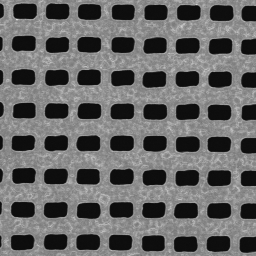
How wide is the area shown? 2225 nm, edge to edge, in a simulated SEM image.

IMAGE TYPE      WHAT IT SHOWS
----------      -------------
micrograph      a regular array of holes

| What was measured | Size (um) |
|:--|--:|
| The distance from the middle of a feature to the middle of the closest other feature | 0.28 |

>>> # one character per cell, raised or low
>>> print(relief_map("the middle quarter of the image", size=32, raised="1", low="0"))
11111111111111111111111111111111
11111000111111110111111111111111
01110000011100000011000000110000
01100000011100000011000000110000
01100000011100000011000001110000
11111111111110001111000001110000
11111111111111111111111111111111
11111111111111111111111111111111
11111111111111111111111111111111
11111111111111111111111111111111
01110000011100000111000000110000
01100000011100000011000000110000
01100000011000000011000000110000
11110000011100000111000001110000
11111111111111111111111111111111
11111111111111111111111111111111
11111111111111111111111111111111
11111111111111111111111111111111
01100000011100000111000000110000
01100000011000000011000000110000
01100000011100000011000000110000
11110000011100001111000001110000
11111111111111111111111111111111
11111111111111111111111111111111
11111111111111111111111111111111
11111111111111111111111111111111
11110000111100000111110001111111
01100000011100000011000001110000
01100000011000000111000000110000
11100000011100000111000001110000
11111111111111111111111111111100
11111111111111111111111111111111